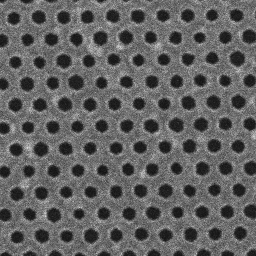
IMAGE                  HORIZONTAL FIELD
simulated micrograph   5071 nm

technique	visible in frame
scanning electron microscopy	a regular array of holes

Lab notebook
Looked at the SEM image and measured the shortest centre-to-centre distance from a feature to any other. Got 479 nm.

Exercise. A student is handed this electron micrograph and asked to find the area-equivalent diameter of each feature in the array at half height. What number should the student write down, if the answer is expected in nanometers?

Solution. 276